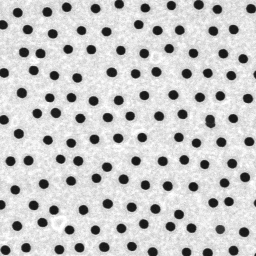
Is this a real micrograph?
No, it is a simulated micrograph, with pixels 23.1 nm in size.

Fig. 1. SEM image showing a regular array of holes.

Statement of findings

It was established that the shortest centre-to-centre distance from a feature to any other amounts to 482 nm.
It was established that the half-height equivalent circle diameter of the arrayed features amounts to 233 nm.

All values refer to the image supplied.